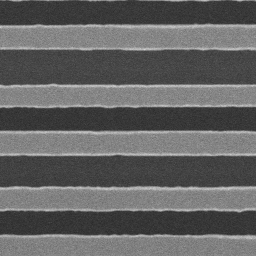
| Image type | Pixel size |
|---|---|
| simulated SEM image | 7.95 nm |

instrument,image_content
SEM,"lines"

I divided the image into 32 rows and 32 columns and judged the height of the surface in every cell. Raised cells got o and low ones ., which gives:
................................
................................
................................
oooooooooooooooooooooooooooooooo
oooooooooooooooooooooooooooooooo
oooooooooooooooooooooooooooooooo
................................
................................
................................
................................
................................
oooooooooooooooooooooooooooooooo
oooooooooooooooooooooooooooooooo
................................
................................
................................
oooooooooooooooooooooooooooooooo
oooooooooooooooooooooooooooooooo
oooooooooooooooooooooooooooooooo
................................
................................
................................
................................
oooooooooooooooooooooooooooooooo
oooooooooooooooooooooooooooooooo
oooooooooooooooooooooooooooooooo
................................
................................
................................
oooooooooooooooooooooooooooooooo
oooooooooooooooooooooooooooooooo
oooooooooooooooooooooooooooooooo